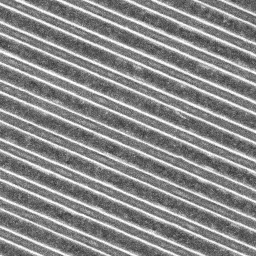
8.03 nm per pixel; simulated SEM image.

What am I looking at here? parallel lines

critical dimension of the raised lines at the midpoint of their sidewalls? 0.141 micrometres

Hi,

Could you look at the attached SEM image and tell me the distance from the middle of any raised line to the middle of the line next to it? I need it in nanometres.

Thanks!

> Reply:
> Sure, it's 216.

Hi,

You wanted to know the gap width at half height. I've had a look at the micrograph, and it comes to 74.7 nm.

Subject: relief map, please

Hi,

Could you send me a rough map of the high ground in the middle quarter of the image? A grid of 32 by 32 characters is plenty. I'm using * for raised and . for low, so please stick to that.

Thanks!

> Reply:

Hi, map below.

***.......**********.......*****
*****.......**********......****
********......***********......*
**********......***********.....
..**********......***********...
....***********......***********
......***********......*********
**.......**********......*******
*****......***********......****
*******......***********.......*
*********......***********......
.***********......***********...
...***********......***********.
.....***********.......*********
**......***********......*******
****......***********......*****
******......***********......***
*********......***********......
***********......***********....
..***********......***********..
.....***********......**********
*......***********......********
***......***********......******
******......***********......***
********......***********......*
**********......***********.....
..***********......***********..
....***********......***********
......***********......*********
**.......***********......******
*****......***********......****
*******......***********......**